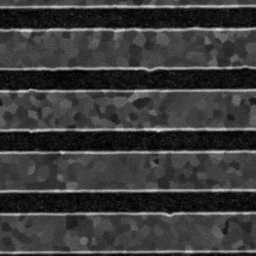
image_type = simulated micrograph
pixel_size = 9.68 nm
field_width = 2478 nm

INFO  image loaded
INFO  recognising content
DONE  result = one or a few lines or trenches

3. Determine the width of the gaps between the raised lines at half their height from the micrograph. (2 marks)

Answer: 220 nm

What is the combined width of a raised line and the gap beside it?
0.593 micrometres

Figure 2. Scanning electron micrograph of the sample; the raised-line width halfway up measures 374 nm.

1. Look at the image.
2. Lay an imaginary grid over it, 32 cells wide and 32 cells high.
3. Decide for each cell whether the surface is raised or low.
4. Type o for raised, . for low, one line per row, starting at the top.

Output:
oooooooooooooooooooooooooooooooo
................................
................................
................................
oooooooooooooooooooooooooooooooo
oooooooooooooooooooooooooooooooo
oooooooooooooooooooooooooooooooo
oooooooooooooooooooooooooooooooo
ooooooooo.oooooooooooooo........
................................
................................
oooooooooooooooooooooooooooooooo
oooooooooooooooooooooooooooooooo
oooooooooooooooooooooooooooooooo
oooooooooooooooooooooooooooooooo
oooooooooooooooooooooooooooooooo
................................
................................
................................
oooooooooooooooooooooooooooooooo
oooooooooooooooooooooooooooooooo
oooooooooooooooooooooooooooooooo
oooooooooooooooooooooooooooooooo
oooooooooooooooooooooooooooooooo
................................
................................
................................
oooooooooooooooooooooooooooooooo
oooooooooooooooooooooooooooooooo
oooooooooooooooooooooooooooooooo
oooooooooooooooooooooooooooooooo
oooooooooooooooooooo............